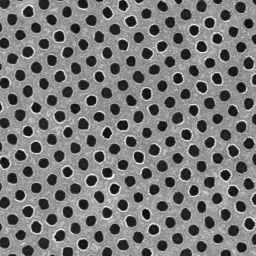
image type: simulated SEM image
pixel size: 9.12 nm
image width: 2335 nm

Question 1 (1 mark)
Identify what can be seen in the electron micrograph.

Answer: a regular array of holes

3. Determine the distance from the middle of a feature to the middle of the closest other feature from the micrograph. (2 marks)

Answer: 158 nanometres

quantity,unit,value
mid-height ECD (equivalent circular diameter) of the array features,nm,102